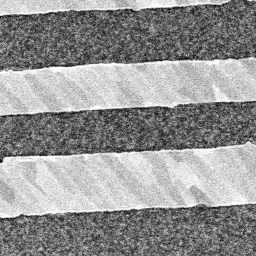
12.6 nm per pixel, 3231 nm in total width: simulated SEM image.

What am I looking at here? one or a few lines or trenches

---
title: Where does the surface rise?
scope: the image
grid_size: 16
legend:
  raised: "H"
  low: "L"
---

HHHHHHHHHLLLLLLL
LLLLLLLLLLLLLLLL
LLLLLLLLLLLLLLLL
LLLLLLLLLLLLLLLL
HHHHHHHHHHHHHHHH
HHHHHHHHHHHHHHHH
HHHHHHHHHHHLLLLL
LLLLLLLLLLLLLLLL
LLLLLLLLLLLLLLLL
LLLLLLLLLHHHHHHH
HHHHHHHHHHHHHHHH
HHHHHHHHHHHHHHHH
HHHHHHHHHHHHHHHH
HLLLLLLLLLLLLLLL
LLLLLLLLLLLLLLLL
LLLLLLLLLLLLLLLL